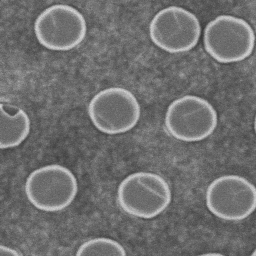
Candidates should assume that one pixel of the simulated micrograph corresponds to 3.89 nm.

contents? raised bodies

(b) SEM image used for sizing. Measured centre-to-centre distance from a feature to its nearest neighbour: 0.298 microns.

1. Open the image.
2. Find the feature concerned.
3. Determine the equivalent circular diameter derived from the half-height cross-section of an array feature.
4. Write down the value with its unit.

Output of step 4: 179 nm